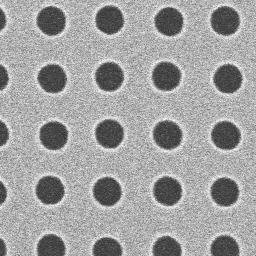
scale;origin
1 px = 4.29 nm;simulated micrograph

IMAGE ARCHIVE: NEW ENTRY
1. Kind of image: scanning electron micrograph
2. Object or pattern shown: a regular array of holes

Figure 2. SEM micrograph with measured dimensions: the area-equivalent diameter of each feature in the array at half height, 0.123 µm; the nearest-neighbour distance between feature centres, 242 nanometres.